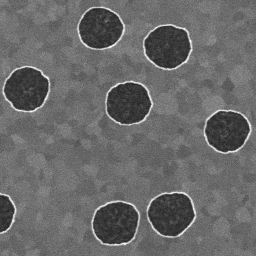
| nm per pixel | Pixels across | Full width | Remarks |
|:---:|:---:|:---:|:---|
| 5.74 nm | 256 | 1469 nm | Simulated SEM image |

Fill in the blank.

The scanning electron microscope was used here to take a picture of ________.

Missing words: holes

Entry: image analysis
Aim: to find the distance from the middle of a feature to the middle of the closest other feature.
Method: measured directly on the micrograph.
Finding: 396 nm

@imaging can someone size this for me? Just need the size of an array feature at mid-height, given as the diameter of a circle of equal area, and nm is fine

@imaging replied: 255